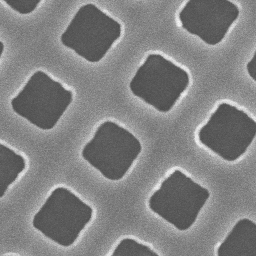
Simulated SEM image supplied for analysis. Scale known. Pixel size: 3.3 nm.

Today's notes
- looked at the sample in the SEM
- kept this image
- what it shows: holes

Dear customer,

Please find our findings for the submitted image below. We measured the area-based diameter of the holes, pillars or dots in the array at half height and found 174 nanometers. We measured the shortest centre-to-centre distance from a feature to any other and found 274 nanometers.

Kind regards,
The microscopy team